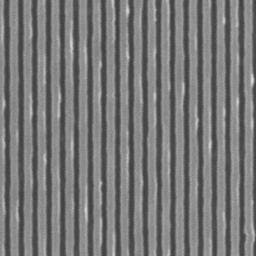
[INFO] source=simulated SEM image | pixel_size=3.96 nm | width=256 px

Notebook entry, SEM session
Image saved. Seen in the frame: parallel lines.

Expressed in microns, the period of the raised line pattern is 0.0547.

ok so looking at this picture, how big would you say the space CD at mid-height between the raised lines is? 24.3 nanometers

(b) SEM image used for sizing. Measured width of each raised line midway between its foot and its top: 7.88 pixels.